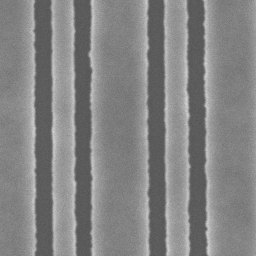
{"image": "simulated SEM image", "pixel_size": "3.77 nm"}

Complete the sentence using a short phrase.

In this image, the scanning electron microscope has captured lines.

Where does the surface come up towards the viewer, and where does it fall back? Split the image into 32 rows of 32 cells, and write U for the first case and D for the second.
UUUUDDUUUDDUUUUUUUDDDUUDDDUUUUUU
UUUUDDUUUDDUUUUUUUDDDUUDDDUUUUUU
UUUUDDUUUDDUUUUUUUDDDUUDDDUUUUUU
UUUUDDDUUDDUUUUUUUDDDUUDDDUUUUUU
UUUUDDDUUDDUUUUUUUDDDUUUDDUUUUUU
UUUUDDDUUDDUUUUUUUDDDUUDDDUUUUUU
UUUUDDDUUDDUUUUUUUDDDUUDDDUUUUUU
UUUUDDDUUDDUUUUUUUDDDUUDDDUUUUUU
UUUUDDDUUDDUUUUUUUDDDUUDDDUUUUUU
UUUUDDDUUDDUUUUUUUDDDUUUDDUUUUUU
UUUUDDDUUDDUUUUUUUDDDUUDDDUUUUUU
UUUUDDDUUDDUUUUUUUDDDUUDDDUUUUUU
UUUUDDDUUDDUUUUUUUDDDUUUDDUUUUUU
UUUUDDDUUDDUUUUUUUDDDUUUDDUUUUUU
UUUUDDDUUDDUUUUUUUDDDUUUDDUUUUUU
UUUUDDDUUDDUUUUUUUDDDUUUDDUUUUUU
UUUUDDDUUDDUUUUUUUDDDUUUDDUUUUUU
UUUUDDDUUDDUUUUUUUDDDUUUDDUUUUUU
UUUUDDDUUDDUUUUUUUDDDUUUDDUUUUUU
UUUUDDDUUDDUUUUUUUUDDUUUDDUUUUUU
UUUUDDDUUDDUUUUUUUDDDUUUDDUUUUUU
UUUUDDDUUDDUUUUUUUDDDUUUDDUUUUUU
UUUUDDDUUDDDUUUUUUUDDUUUDDUUUUUU
UUUUDDDUUDDUUUUUUUDDDUUUDDUUUUUU
UUUUDDDUUDDUUUUUUUDDDUUUDDUUUUUU
UUUUDDDUUDDUUUUUUUUDDUUUDDUUUUUU
UUUUDDDUUDDUUUUUUUUDDUUUDDUUUUUU
UUUUDDDUUDDUUUUUUUUDDUUUDDUUUUUU
UUUUDDDUUDDUUUUUUUUDDUUUDDUUUUUU
UUUUDDDUUDDUUUUUUUUDDUUUDDUUUUUU
UUUUDDDUUDDUUUUUUUUDDUUUDDUUUUUU
UUUUDDDUUDDUUUUUUUUDDUUUDDUUUUUU